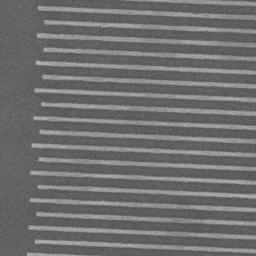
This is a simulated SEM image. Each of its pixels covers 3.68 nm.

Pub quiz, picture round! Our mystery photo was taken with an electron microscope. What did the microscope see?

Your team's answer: parallel lines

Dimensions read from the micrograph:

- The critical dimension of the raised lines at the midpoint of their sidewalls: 13.3 nm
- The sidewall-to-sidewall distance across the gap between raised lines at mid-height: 37.6 nm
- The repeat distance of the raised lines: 0.0504 µm